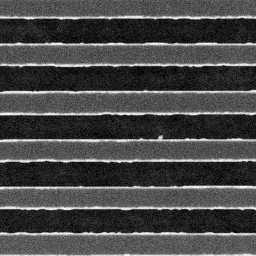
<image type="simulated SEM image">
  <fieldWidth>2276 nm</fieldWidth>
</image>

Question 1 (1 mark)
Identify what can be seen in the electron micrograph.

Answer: lines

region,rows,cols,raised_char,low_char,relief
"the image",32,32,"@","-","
@@@@@@@@@@@@@@@@@@@@@@@@@@@@@@@@
@@@@@@@@@@@@@@@@@@@@@@@@@@@@@@@@
--------------------------------
--------------------------------
--------------------------------
--@--@@@--@--@@@--@@@---@@@---@@
@@@@@@@@@@@@@@@@@@@@@@@@@@@@@@@@
@@@@@@@@@@@@@@@@@@@@@@@@@@@@@@@@
--------------------------------
--------------------------------
--------------------------------
@@@@@@@@@@@@@@@@@@@@@@@@@@@@@@@@
@@@@@@@@@@@@@@@@@@@@@@@@@@@@@@@@
@@@@@@@@@@@@@@@@@@@@@@@@@@@@@@@@
--------------------------------
--------------------------------
--------------------------------
-----------------------@-@--@@@-
@@@@@@@@@@@@@@@@@@@@@@@@@@@@@@@@
@@@@@@@@@@@@@@@@@@@@@@@@@@@@@@@@
--------------------------------
--------------------------------
--------------------------------
@@@@@@@@@@@@@@@@@@@@@@@@@@@@@@@@
@@@@@@@@@@@@@@@@@@@@@@@@@@@@@@@@
@@@@@@@@@@@@@@@@@@@@@@@@@@@@@@@@
--------------------------------
--------------------------------
--------------------------------
@@@@@@@@@@@@@@@@@@@@@@@@@@@@@@@@
@@@@@@@@@@@@@@@@@@@@@@@@@@@@@@@@
@@@@@@@@@@@@@@@@@@@@@@@@@@@@@@@@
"